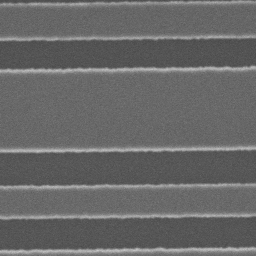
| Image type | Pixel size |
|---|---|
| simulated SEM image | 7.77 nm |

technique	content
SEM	lines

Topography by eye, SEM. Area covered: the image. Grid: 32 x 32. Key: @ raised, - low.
@@@@@@@@@@@@@@@@@@@@@@@@@@@@@@@@
@@@@@@@@@@@@@@@@@@@@@@@@@@@@@@@@
@@@@@@@@@@@@@@@@@@@@@@@@@@@@@@@@
@@@@@@@@@@@@@@@@@@@@@@@@@@@@@@@@
@@@@@@@@@@@@@@@@@@@@@@@@@@@@@@@@
--------------------------------
--------------------------------
--------------------------------
-----------------@-@-@-@@@@@@@@@
@@@@@@@@@@@@@@@@@@@@@@@@@@@@@@@@
@@@@@@@@@@@@@@@@@@@@@@@@@@@@@@@@
@@@@@@@@@@@@@@@@@@@@@@@@@@@@@@@@
@@@@@@@@@@@@@@@@@@@@@@@@@@@@@@@@
@@@@@@@@@@@@@@@@@@@@@@@@@@@@@@@@
@@@@@@@@@@@@@@@@@@@@@@@@@@@@@@@@
@@@@@@@@@@@@@@@@@@@@@@@@@@@@@@@@
@@@@@@@@@@@@@@@@@@@@@@@@@@@@@@@@
@@@@@@@@@@@@@@@@@@@@@@@@@@@@@@@@
@@@@@@@@@@@@@@@@@@@@@@@@@@@@@@@@
--------------------------------
--------------------------------
--------------------------------
--------------------------------
@@@@@@@@@@@@@@@@@@@@@@@@@@@@@@@@
@@@@@@@@@@@@@@@@@@@@@@@@@@@@@@@@
@@@@@@@@@@@@@@@@@@@@@@@@@@@@@@@@
@@@@@@@@@@@@@@@@@@@@@@@@@@@@@@@@
--------------------------------
--------------------------------
--------------------------------
--------------------------------
@@@@@@@@@@@@@@@@@@@@@@@@@@@@@@@@